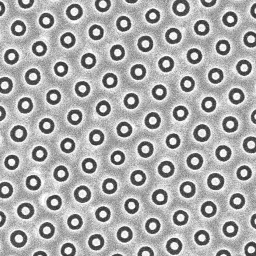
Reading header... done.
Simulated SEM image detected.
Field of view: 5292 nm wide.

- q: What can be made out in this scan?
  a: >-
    a regular array of ring-shaped grooves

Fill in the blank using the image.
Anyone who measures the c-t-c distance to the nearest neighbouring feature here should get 595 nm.